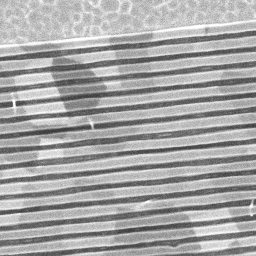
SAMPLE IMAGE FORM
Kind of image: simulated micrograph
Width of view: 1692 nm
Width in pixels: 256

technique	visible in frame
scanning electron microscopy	parallel lines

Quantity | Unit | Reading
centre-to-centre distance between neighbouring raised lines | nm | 101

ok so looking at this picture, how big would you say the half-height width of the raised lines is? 60.7 nm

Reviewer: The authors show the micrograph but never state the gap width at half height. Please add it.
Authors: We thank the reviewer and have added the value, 0.0386 µm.